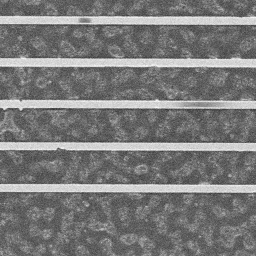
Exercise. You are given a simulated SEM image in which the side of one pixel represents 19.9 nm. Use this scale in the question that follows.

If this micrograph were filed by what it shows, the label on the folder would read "parallel lines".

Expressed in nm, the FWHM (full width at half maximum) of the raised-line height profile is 152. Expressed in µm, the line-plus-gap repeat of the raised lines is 0.836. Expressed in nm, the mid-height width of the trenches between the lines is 692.